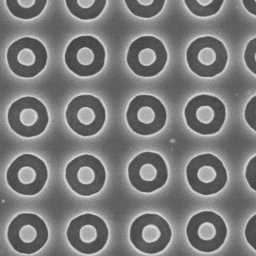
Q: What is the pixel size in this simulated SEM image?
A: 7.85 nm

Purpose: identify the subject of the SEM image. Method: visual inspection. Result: a regular array of ring-shaped grooves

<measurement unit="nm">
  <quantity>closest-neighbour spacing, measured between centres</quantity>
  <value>454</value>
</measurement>